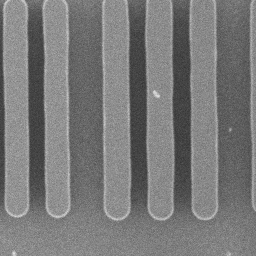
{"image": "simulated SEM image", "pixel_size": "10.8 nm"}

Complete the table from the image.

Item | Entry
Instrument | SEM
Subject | groups of lines, slits or small figures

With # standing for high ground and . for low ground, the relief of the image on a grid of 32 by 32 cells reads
.##..###.....###..###...###....#
.##..###.....###..###...###....#
.##..###.....###..###...###....#
.##...##.....###..####..###....#
.##...##.....###..###...###....#
.##...##.....###..###...###....#
###...##.....###..###...###....#
###...##.....###..###...###....#
.##...##.....###..####..###....#
.##...##.....###..####..###....#
.##...##.....###..####..###....#
.##...##.....###..####..###....#
.##...##.....###..###...###....#
.###..##.....###..###...###....#
.###..##.....###..####..###....#
.###..##.....###..####..###....#
.###..##.....###..####..###....#
.###..##.....###..####..###.....
.###..###....###..####..###.....
.###..###....###..####..###.....
.###..###....###..####..###.....
.###..###....###...###..###.....
.###..###....###...###..###.....
.###..###....###...###..###.....
.###..###....###...###..###.....
.###..###....###...###..###.....
.##...##.....###...###..###.....
................................
................................
................................
................................
................................